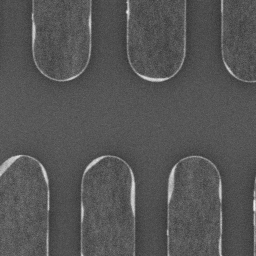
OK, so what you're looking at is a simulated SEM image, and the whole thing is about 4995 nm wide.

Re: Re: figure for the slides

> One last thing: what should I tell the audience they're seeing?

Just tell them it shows groups of lines, slits or small figures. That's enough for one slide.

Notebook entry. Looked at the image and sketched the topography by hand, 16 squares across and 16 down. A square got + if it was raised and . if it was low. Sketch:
..++++..++++..++
..++++..++++..++
..++++..++++..++
..++++..+++...++
...++....++...++
................
................
................
................
................
+++...++...++...
+++..+++...+++..
+++..+++...+++..
+++..+++...+++..
+++..+++...+++..
+++..+++...+++..